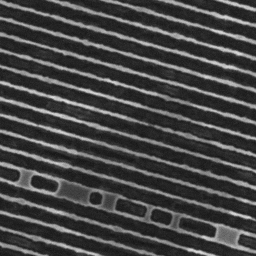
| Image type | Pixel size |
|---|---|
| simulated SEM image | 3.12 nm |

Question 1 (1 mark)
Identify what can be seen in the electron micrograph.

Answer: parallel lines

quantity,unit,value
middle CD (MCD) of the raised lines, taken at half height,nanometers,9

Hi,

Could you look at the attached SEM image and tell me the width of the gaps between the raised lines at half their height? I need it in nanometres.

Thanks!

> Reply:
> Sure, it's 39.3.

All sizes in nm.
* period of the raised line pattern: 48.5